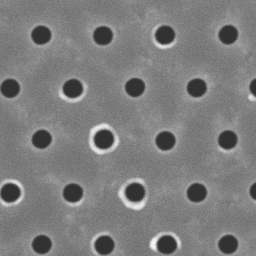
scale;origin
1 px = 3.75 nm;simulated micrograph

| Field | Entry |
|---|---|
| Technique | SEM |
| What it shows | a regular array of holes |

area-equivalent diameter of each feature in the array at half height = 76.4 nm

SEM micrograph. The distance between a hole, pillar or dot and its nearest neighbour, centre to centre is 226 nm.